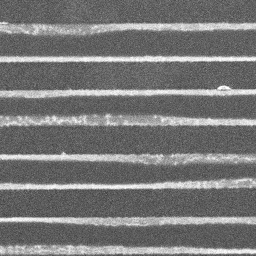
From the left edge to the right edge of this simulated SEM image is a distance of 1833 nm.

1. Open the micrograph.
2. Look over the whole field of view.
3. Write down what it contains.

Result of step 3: lines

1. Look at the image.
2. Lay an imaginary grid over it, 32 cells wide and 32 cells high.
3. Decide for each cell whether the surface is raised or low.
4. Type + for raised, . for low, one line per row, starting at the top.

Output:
................................
................................
................................
.............+++++++++++++++++++
++++++++++++++++++++++++++++++++
++++++++++++++++++++++++++++++++
++++++++++++++++++++++++++++++++
................................
................................
................................
................................
....................++.......+++
++++++++++++++++++++++++++++++++
++++++++++++++++++++++++++++++++
++++++++++++++++++++++++++++++++
................................
................................
................................
................................
................................
++++++++++++++++++++++++++++++++
++++++++++++++++++++++++++++++++
++++++++++++++++++++++++++++++++
................................
................................
................................
................................
++++++++.................+..+...
++++++++++++++++++++++++++++++++
++++++++++++++++++++++++++++++++
++++++++++++++++++++++++++++++++
................................